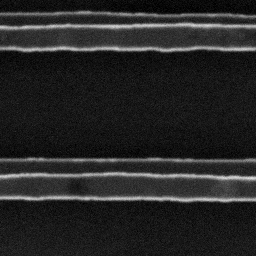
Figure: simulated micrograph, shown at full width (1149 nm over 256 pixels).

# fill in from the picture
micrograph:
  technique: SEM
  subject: lines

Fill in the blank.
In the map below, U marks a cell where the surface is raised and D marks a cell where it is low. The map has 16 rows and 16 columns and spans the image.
DDDDDDDDDDDDDDDD
UUUUUUUUUUUUUUUU
UUUUUUUUUUUUUUUU
DDDDDDDDDDDDDDDD
DDDDDDDDDDDDDDDD
DDDDDDDDDDDDDDDD
DDDDDDDDDDDDDDDD
DDDDDDDDDDDDDDDD
DDDDDDDDDDDDDDDD
DDDDDDDDDDDDDDDD
UUUUUUUUUUUUUUUU
UUUUUUUUUUUUUUUU
DDDDDDDDDDDUUUUU
DDDDDDDDDDDDDDDD
DDDDDDDDDDDDDDDD
DDDDDDDDDDDDDDDD